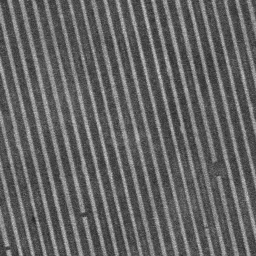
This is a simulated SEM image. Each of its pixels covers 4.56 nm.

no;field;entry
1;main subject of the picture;parallel lines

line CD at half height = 0.0139 micrometres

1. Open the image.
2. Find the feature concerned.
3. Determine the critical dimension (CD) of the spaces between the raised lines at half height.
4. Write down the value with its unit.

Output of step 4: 36.1 nm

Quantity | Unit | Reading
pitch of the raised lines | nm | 53.2